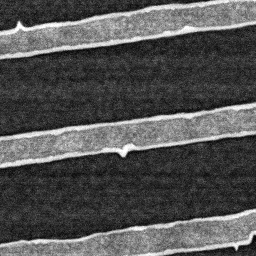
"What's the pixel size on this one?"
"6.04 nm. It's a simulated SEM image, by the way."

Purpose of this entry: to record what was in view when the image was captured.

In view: one or a few lines or trenches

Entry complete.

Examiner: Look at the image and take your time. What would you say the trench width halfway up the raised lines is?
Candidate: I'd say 478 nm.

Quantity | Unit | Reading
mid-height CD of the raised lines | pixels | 27.7